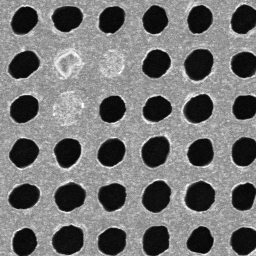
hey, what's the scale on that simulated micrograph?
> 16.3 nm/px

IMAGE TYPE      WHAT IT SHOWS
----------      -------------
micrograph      a regular array of holes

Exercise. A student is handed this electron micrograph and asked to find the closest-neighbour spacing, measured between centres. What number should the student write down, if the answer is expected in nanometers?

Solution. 708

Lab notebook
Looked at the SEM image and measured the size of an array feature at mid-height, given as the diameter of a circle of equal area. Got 0.453 micrometres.